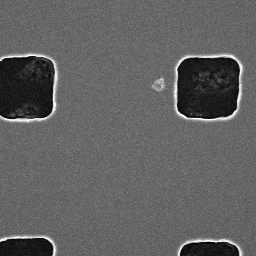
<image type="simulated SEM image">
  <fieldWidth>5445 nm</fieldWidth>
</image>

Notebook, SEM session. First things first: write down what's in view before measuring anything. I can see holes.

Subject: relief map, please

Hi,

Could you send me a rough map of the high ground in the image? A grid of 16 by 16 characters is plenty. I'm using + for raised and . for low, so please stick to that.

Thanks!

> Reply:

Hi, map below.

++++++++++++++++
++++++++++++++++
++++++++++++++++
++++++++++++++++
...++++++++....+
...++++++++....+
...++++++++....+
++++++++++++++++
++++++++++++++++
++++++++++++++++
++++++++++++++++
++++++++++++++++
++++++++++++++++
++++++++++++++++
++++++++++++++++
...++++++++....+